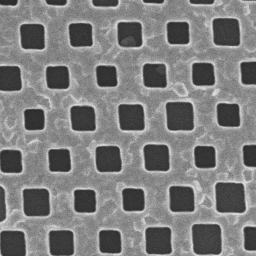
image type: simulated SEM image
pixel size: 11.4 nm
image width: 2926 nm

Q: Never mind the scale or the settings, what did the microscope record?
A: a regular array of holes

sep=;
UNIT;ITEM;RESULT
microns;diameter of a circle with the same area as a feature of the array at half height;0.305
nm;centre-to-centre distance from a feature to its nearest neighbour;548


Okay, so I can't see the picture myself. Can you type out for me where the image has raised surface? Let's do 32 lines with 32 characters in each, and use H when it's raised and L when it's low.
LLHHHHLLHHHHLLLHHHHHHHHHLLHHHHHH
HHHHHHHHHHHHHHHHHHHHHHHHHHHHHHHH
HHHHHHHHHHHHHHHHHHHHHHHHHHHLLLHH
HHLLLHHHHLLLHHHLLLHHHLLLHHHLLLHH
HHHLLLHHHLLLHHHLLLHHHLLLHHHLLLHH
HHHLLLHHHLLHHHHLLLHHHLLHHHHLLLHH
HHHHHHHHHHHHHHHHHHHHHHHHHHHHHHHH
HHHHHHHHHHHHHHHHHHHHHHHHHHHHHHHH
LLHHHHLLHHHHLLHHHHLLLHHHLLLHHHLL
LLLHHHLLLHHHLLLHHHLLLHHHLLLHHHLL
LLLHHHLLLHHHLLHHHHLLLHHHLLLHHHHL
HHHHHHHHHHHHHHHHHHHHHHHHHHHHHHHH
HHHHHHHHHHHHHHHHHHHHHHHHHHHHHHHH
HHHHHHHHHLLLHHHLLLHHHLLLHHHLLLHH
HHHLLLHHHLLLHHHLLLHHHLLLHHHLLLHH
HHHLLLHHHLLLHHHLLLHHHLLLHHHLLLHH
HHHHHHHHHHLHHHHHHHHHHHHHHHHHHHHH
HHHHHHHHHHHHHHHHHHHHHHHHHHHHHHHH
HHHHHHHHHHHHLLLHHHLLLHHHLLLHHHLL
LLLHHHLLLHHHLLLHHHLLLHHHLLLHHHLL
LLLHHHLLLHHHLLLHHHLLLHHHLLLHHHHL
LLLHHHHLHHHHHLLHHHHHHHHHHHHHHHHH
HHHHHHHHHHHHHHHHHHHHHHHHHHHHHHHH
HHHHHHHHHHHHHHHHHHHHHLLLHHHLLLLH
LHHLLLHHHLLLHHHLLLHHHLLLHHHLLLLH
LHHLLLHHHLLLHHHLLLHHHLLLHHHLLLLH
LHHLLLHHHHLLHHHHLHHHHHLLHHHLLLHH
HHHHHHHHHHHHHHHHHHHHHHHHHHHHHHHH
HHHHHHHHHHHHHHHHHHHLLHHHLLLLHHHL
LLLHHHLLLHHHLLLHHHLLLHHHLLLLHHLL
LLLHHHLLLHHHLLLHHHLLLHHHLLLLHHLL
LLLHHHLLLHHHHLLHHHLLLHHHLLLLHHHH